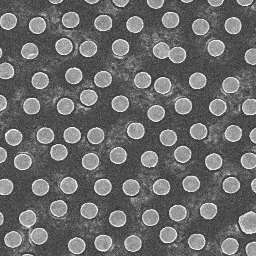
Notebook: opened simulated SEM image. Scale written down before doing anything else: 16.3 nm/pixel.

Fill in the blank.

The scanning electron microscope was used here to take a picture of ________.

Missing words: a regular array of raised bodies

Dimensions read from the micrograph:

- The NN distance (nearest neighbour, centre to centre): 434 nanometres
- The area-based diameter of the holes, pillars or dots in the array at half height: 271 nanometres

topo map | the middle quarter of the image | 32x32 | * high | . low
................................
.***............................
.***....***.......***...........
.****...****......****..*......*
.***....****......****.****....*
........***.......***..****.....
.......................***......
....****........................
....****.....***................
**..****....****............****
**..........****......**....****
**..**.......**......****...****
*....................****.......
.....................****.......
................................
................****............
.**....**.......****............
****..****......****....****....
****..****........*.....****....
.**....**...............****....
................................
*...........***.............***.
*...........****....***.....****
.....****...***....****.....***.
.....****...***....****......*..
.....***............**..........
................................
................................
..............................**
***.....***....***.....***....**
***.....****...****...****....**
***.....****...****...****....**